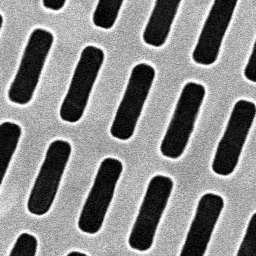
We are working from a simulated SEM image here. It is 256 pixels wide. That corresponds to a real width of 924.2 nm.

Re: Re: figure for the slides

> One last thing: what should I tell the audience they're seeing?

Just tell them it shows holes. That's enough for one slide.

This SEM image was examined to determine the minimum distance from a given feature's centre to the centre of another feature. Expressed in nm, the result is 193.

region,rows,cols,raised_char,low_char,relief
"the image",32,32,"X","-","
XXXXX---XXXX---XXXX---XXXXX---XX
XXXXXXXXXXXX---XXXX---XXXX---XXX
XXXXXXXXXXXX--XXXXX---XXXX---XXX
XXXXXXXXXXXXX-XXXX---XXXX---XXXX
XXXX---XXXXXXXXXXX---XXXX---XXXX
XXX---XXXXXXXXXXXX--XXXXX---XXXX
XXX---XXXX---XXXXXXXXXXX---XXXX-
XXX---XXXX---XXXXXXXXXXX---XXXX-
XX---XXXX---XXXXX--XXXXXXXXXXXX-
XX---XXXX---XXXX---XXXXXXXXXXXX-
X----XXXX---XXXX---XXXX--XXXXXXX
X---XXXX---XXXXX---XXXX---XXXXXX
X---XXXX---XXXX---XXXX---XXXXXXX
XXXXXXXX---XXXX---XXXX---XXXX---
XXXXXXXX--XXXX---XXXXX---XXXX---
--XXXXXXXXXXXX---XXXX---XXXX---X
---XXXXXXXXXXX---XXXX---XXXX---X
--XXXXXXXXXXXXXXXXXX----XXXX---X
--XXXX---XXXXXXXXXXX---XXXX---XX
--XXXX---XXXXXXXXXXXX-XXXXX---XX
-XXXX---XXXXX--XXXXXXXXXXXX---XX
-XXXX---XXXX---XXXXXXXXXXXX--XXX
XXXXX---XXXX---XXXX--XXXXXXXXXXX
XXXX---XXXX---XXXX----XXXXXXXXXX
XXXX---XXXX---XXXX---XXXX--XXXXX
XXX---XXXXX---XXXX---XXXX---XXXX
XXXX--XXXX---XXXX---XXXX----XXXX
XXXXXXXXXX---XXXX---XXXX---XXXX-
XXXXXXXXXX---XXXX---XXXX---XXXX-
XX--XXXXXXXXXXXX---XXXX---XXXXX-
XX---XXXXXXXXXXX---XXXX---XXXX--
X---XXXXX-XXXXXXXXXXXXX---XXXX--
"